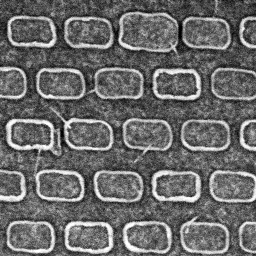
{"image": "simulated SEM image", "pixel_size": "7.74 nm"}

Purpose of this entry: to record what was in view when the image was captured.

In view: a regular array of raised bodies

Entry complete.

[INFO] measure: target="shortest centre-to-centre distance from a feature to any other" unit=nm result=448